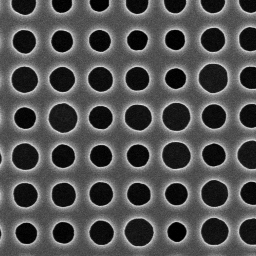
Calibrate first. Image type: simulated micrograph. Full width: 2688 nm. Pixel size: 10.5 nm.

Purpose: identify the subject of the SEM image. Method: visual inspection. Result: a regular array of holes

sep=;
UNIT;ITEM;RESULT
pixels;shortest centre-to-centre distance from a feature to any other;37.6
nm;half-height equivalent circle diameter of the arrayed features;252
